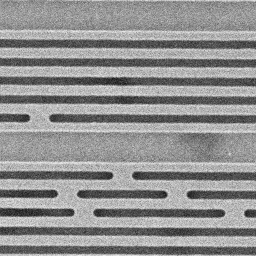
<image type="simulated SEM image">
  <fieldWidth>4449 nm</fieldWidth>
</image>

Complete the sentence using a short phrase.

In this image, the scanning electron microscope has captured groups of lines, slits or small figures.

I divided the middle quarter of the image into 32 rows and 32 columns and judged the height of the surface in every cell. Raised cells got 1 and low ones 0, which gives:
00000000000000000000000000000000
11111111111111111111111111111111
11111111111111111111111111111111
00000000000000000000000000000000
00000000000000000000000000000000
00111101111110000000000000000000
11111111111111111111111111111111
11111111111111111111111111111111
00000000000000000000000000000000
00000000000000000000000000000000
11111111111111111111111111111111
11111111111111111111111111111111
00000000000000000000000000011100
00000000000000000000000000000000
00000000000000000000000000000000
11111111111111111111111111111111
11111111111111111111111111111111
00000000000000000000000000000000
00000000000000000000000000000000
00000000000000000000000000000000
00000000000000000000000000000000
00000000000000000000000000000000
00000000000000000000000000000000
00000000000000000000000000000000
00000000000000000000000000000000
11111111111111111111111111111111
11111111111111111111111111111111
00000000000011111000000000000000
00000000000011111000000000000000
11111111111111111111111111111111
11111111111111111111111111111111
11110000000000000000000001111111